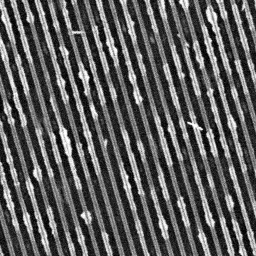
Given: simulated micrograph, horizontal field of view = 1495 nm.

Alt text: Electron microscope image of parallel lines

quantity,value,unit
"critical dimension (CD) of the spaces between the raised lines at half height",7.83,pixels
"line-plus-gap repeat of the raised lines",68.4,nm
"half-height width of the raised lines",21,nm